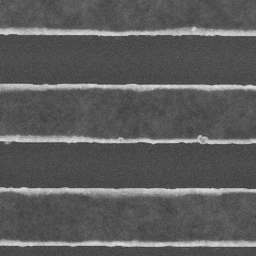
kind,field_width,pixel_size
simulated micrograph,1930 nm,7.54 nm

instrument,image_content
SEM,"lines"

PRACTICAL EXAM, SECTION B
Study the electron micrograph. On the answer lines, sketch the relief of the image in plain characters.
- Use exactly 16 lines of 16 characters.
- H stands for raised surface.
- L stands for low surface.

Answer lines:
HHHHHHHHHHHHHHHH
HHHHHHHHHHHHHHHH
LLLLLLLLLLLLLLLL
LLLLLLLLLLLLLLLL
LLLLLLLLLLLLLLLL
HHHHHHHHHHHHHHHH
HHHHHHHHHHHHHHHH
HHHHHHHHHHHHHHHH
HHHHHHHHHHHHHHHH
LLLLLLLLLLLLLLLL
LLLLLLLLLLLLLLLL
LLLLLLLLLLLLLLLL
HHHHHHHHHHHHHHHH
HHHHHHHHHHHHHHHH
HHHHHHHHHHHHHHHH
LLLLLLLLLLLLLLLL